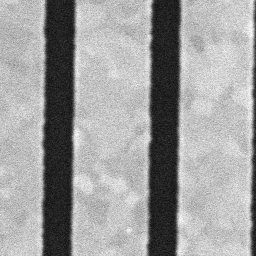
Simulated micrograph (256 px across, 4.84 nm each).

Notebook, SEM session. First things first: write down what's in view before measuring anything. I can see lines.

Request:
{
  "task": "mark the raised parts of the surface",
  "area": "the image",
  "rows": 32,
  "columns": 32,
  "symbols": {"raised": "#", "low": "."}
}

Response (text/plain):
######....#########....#########
######....#########....#########
######....#########....#########
#####.....#########....#########
#####....##########....#########
######...##########....#########
#####....##########....#########
######...##########....#########
######...##########....#########
#####....##########....########.
#####....##########....########.
#####....##########....########.
#####....##########...#########.
#####....##########...#########.
#####....##########...#########.
#####....##########...#########.
#####....##########...#########.
#####....##########...#########.
#####....##########...#########.
#####....##########...#########.
#####....##########...#########.
#####....#########....#########.
#####....#########....#########.
#####....##########...#########.
#####....##########...#########.
#####....#########....#########.
#####....##########...#########.
#####....##########...#########.
#####....#########....#########.
#####....#########....#########.
#####....#########....#########.
#####....#########....#########.